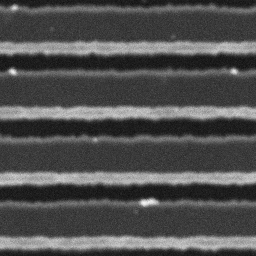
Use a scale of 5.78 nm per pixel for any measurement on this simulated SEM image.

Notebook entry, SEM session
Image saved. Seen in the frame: lines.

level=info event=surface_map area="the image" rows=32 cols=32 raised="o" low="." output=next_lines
................................
oooooooooooooooooooooooooooooooo
oooooooooooooooooooooooooooooooo
oooooooooooooooooooooooooooooooo
oooooooooooooooooooooooooooooooo
oooooooooooooooooooooooooooooooo
ooooooooooooooooooooooooooooooo.
................................
................................
oooooooooooooooooooooooooooooooo
oooooooooooooooooooooooooooooooo
oooooooooooooooooooooooooooooooo
oooooooooooooooooooooooooooooooo
oooooooooooooooooooooooooooooooo
oooooooooooooooooooooo.oooo.oooo
................................
................................
oooooooooooooooooooooooooooooooo
oooooooooooooooooooooooooooooooo
oooooooooooooooooooooooooooooooo
oooooooooooooooooooooooooooooooo
oooooooooooooooooooooooooooooooo
oooooooooooooooooooooooooooooooo
................................
................................
ooo.o..ooooooooooooooooooooooooo
oooooooooooooooooooooooooooooooo
oooooooooooooooooooooooooooooooo
oooooooooooooooooooooooooooooooo
oooooooooooooooooooooooooooooooo
oooooooooooooooooooooooooooooooo
................................